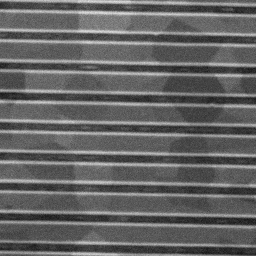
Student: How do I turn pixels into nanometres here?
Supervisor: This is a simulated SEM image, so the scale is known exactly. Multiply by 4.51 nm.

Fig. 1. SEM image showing parallel lines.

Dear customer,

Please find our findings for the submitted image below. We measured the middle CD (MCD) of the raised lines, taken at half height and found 91.3 nanometres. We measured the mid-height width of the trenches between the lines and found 45.3 nm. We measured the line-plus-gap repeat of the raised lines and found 136 nm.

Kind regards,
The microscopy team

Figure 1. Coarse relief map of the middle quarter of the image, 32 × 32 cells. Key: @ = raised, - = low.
--------------------------------
--------------------------------
@@@@@@@@@@@@@@@@@@@@@@@@@@@-----
@@@@@@@@@@@@@@@@@@@@@@@@@@@@@@@@
@@@@@@@@@@@@@@@@@@@@@@@@@@@@@@@@
@@@@@@@@@@@@@@@@@@@@@@@@@@@@@@@@
@@@@@@@@@@@@@@@@@@@@@@@@@@@@@@@@
-------------------------@@@@@@@
--------------------------------
--------------------------------
@@@@@@@@@@@@@@@@@@@@@@@@@@@@@@@@
@@@@@@@@@@@@@@@@@@@@@@@@@@@@@@@@
@@@@@@@@@@@@@@@@@@@@@@@@@@@@@@@@
@@@@@@@@@@@@@@@@@@@@@@@@@@@@@@@@
@------@@@@@@@@@@@@@@@@@@@@@@@@@
--------------------------------
--------------------------------
@@@@@@@@@@@@@@@@@@@@------------
@@@@@@@@@@@@@@@@@@@@@@@@@@@@@@@@
@@@@@@@@@@@@@@@@@@@@@@@@@@@@@@@@
@@@@@@@@@@@@@@@@@@@@@@@@@@@@@@@@
@@@@@@@@@@@@@@@@@@@@@@@@@@@@@@@@
-------------------------@@@@@@@
--------------------------------
--------------------------------
@@@@@@@@@@@@@@@@@@@@@@@@@@@@@@@@
@@@@@@@@@@@@@@@@@@@@@@@@@@@@@@@@
@@@@@@@@@@@@@@@@@@@@@@@@@@@@@@@@
@@@@@@@@@@@@@@@@@@@@@@@@@@@@@@@@
@@@@@@@@@@@@@@@@@@@@@@@@@@@@@@@@
--------------------------------
--------------------------------